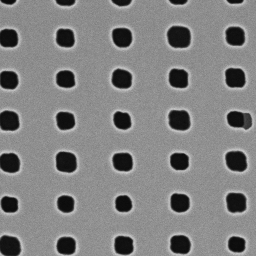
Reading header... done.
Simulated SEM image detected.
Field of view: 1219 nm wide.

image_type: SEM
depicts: a regular array of holes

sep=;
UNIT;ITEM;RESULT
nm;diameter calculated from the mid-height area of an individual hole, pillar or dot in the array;92.1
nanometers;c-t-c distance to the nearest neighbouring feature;198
